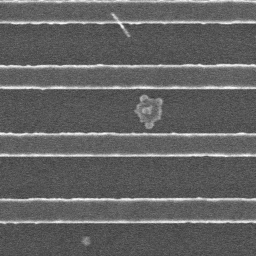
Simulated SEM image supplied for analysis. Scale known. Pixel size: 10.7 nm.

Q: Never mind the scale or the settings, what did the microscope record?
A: lines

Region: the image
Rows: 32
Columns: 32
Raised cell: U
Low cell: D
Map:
UUUUUUUUUUUUUUUUUUUUUUUUUUUUUUUU
UUUUUUUUUUUUUUUUUUUUUUUUUUUUUUUU
UUUUUUUUUUUUUUUUUUUUUUUUUUUUUUUU
DDDDDDDDDDDDDDDDDDDDDDDDDDDDDDDD
DDDDDDDDDDDDDDDDDDDDDDDDDDDDDDDD
DDDDDDDDDDDDDDDDDDDDDDDDDDDDDDDD
DDDDDDDDDDDDDDDDDDDDDDDDDDDDDDDD
DDDDDDDDDDDDDDDDDDDDDDDDDDDDDDDD
UUUUUUUUUUUUUUUUUUUUUUUUUUUUUUUU
UUUUUUUUUUUUUUUUUUUUUUUUUUUUUUUU
UUUUUUUUUUUUUUUUUUUUUUUUUUUUUUUU
DDDDDDDDDDDDDDDDDDDDDDDDDDDDDDDD
DDDDDDDDDDDDDDDDDDDDDDDDDDDDDDDD
DDDDDDDDDDDDDDDDDDDDDDDDDDDDDDDD
DDDDDDDDDDDDDDDDDDDDDDDDDDDDDDDD
DDDDDDDDDDDDDDDDDDDDDDDDDDDDDDDD
DDDDDDDDDDDDDDDDDDDDDDDDDDDDDDDD
UUUUUUUUUUUUUUUUUUUUUUUUUUUUUUUU
UUUUUUUUUUUUUUUUUUUUUUUUUUUUUUUU
DDDDDDDDDDDDDDDDDDDDDDDDDDDDUDDD
DDDDDDDDDDDDDDDDDDDDDDDDDDDDDDDD
DDDDDDDDDDDDDDDDDDDDDDDDDDDDDDDD
DDDDDDDDDDDDDDDDDDDDDDDDDDDDDDDD
DDDDDDDDDDDDDDDDDDDDDDDDDDDDDDDD
DDDDDDDDDDDDDDDDDDDDDDDDDDDDDDDD
UUUUUUUUUUUUUUUUUUUUUUUUUUUUUUUU
UUUUUUUUUUUUUUUUUUUUUUUUUUUUUUUU
UUUUUUUUUUUUUUUUUUUUUUUUUUUUUUUU
DDDDDDDDDDDDDDDDDDDDDDDDDDDDDDDD
DDDDDDDDDDDDDDDDDDDDDDDDDDDDDDDD
DDDDDDDDDDDDDDDDDDDDDDDDDDDDDDDD
DDDDDDDDDDDDDDDDDDDDDDDDDDDDDDDD